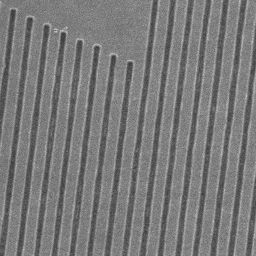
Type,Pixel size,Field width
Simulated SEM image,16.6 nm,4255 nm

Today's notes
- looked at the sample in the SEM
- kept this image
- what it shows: parallel lines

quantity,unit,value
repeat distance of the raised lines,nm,291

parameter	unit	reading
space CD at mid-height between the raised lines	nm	111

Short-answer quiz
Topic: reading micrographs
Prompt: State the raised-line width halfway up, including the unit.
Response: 182 nm